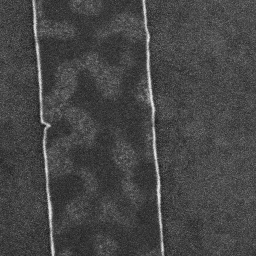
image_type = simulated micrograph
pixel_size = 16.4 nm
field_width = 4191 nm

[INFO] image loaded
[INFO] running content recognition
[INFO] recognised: one or a few lines or trenches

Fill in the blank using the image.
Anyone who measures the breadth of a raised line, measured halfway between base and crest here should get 1800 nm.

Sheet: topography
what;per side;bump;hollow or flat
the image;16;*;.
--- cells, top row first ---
..*******.......
..*******.......
..*******.......
..*******.......
..*******.......
...******.......
...*******......
...*******......
...*******......
...*******......
...*******......
...*******......
...*******......
...*******......
...*******......
...*******......